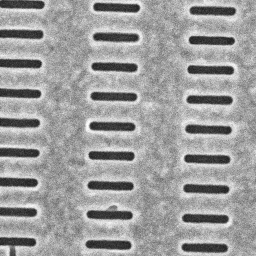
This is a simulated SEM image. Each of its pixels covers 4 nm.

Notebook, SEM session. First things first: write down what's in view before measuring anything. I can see a regular array of holes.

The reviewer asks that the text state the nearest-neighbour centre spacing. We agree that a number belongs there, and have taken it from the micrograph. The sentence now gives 117 nm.